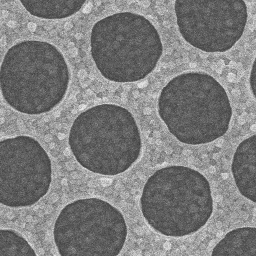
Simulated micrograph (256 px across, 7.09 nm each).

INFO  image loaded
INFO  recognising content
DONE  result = holes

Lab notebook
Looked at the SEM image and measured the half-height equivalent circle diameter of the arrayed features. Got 511 nm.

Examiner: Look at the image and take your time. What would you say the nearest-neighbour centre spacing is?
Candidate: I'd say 661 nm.